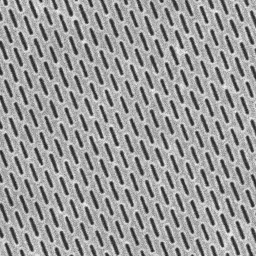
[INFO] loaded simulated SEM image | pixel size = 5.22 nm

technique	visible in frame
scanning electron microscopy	a regular array of holes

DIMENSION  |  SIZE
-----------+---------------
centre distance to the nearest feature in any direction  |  0.0843 µm